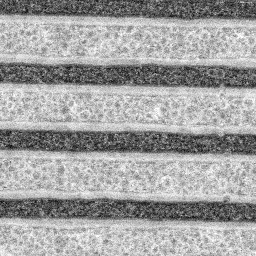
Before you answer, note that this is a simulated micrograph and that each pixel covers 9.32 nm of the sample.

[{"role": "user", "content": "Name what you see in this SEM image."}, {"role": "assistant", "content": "one or a few lines or trenches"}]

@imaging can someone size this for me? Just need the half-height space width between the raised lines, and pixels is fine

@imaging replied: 28.6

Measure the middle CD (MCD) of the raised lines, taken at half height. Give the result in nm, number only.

363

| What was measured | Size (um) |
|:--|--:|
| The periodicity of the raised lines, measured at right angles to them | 0.63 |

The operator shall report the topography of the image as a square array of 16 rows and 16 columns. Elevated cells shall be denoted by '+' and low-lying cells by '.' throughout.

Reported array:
................
++++++++++++++++
++++++++++++++++
++++++++++++++++
................
++..............
++++++++++++++++
++++++++++++++++
................
................
++++++++++++++++
++++++++++++++++
................
................
++++++++++++++++
++++++++++++++++